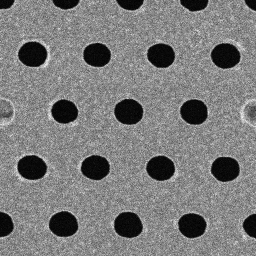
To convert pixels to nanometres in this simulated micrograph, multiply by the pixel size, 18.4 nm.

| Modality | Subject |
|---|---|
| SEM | a regular array of holes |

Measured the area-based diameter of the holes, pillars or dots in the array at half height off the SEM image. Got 0.504 um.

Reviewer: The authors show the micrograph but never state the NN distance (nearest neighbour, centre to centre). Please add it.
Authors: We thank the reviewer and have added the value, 1180 nm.